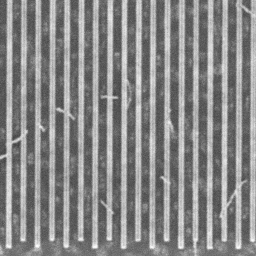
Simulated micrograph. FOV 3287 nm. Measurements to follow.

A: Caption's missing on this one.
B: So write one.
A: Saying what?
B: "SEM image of parallel lines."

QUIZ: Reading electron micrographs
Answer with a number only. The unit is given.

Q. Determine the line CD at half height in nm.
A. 48.1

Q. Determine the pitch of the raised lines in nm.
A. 184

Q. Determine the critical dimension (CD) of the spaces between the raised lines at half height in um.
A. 0.135